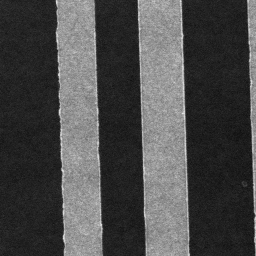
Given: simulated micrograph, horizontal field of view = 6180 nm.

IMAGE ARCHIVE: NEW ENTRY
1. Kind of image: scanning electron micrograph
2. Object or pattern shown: one or a few lines or trenches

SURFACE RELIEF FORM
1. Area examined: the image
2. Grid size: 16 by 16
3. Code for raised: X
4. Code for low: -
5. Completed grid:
----XX---XX-----
----XX---XX-----
----XX---XX-----
----XX---XX-----
----XX---XX-----
----XX---XX-----
----XX---XX-----
----XX---XXX----
----XX---XXX----
----XX---XXX----
----XX---XXX----
----XX---XXX----
----XX---XXX----
----XX---XXX----
----XX---XXX----
----XX---XXX----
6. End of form